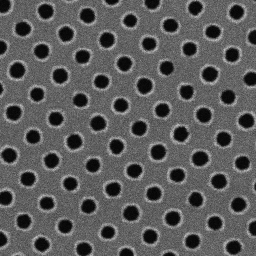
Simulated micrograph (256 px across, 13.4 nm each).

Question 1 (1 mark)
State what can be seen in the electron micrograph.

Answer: a regular array of holes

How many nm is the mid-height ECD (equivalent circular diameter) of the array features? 200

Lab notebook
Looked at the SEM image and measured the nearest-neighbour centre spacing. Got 393 nm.